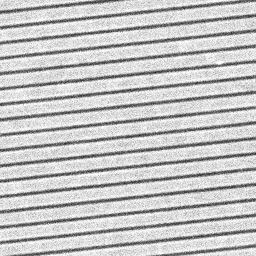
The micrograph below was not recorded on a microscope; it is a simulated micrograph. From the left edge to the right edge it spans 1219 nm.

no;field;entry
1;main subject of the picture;parallel lines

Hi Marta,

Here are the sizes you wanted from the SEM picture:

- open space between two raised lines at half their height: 16.5 nanometres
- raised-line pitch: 15.3 pixels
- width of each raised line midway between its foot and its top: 0.0533 microns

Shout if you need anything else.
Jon